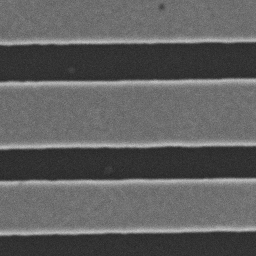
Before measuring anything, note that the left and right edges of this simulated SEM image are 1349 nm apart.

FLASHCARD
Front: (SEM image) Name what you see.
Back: lines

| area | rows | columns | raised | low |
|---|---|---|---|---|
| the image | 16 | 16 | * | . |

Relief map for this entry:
****************
****************
****************
................
................
****************
****************
****************
****************
................
................
****************
****************
****************
***********.....
................